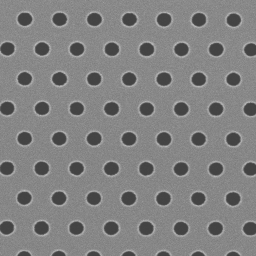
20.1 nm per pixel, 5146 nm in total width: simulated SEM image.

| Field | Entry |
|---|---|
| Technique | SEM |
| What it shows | a regular array of holes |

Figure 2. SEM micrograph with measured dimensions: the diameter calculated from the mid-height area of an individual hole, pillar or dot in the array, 286 nanometres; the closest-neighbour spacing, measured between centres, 691 nm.